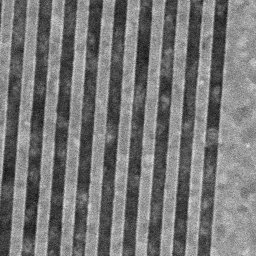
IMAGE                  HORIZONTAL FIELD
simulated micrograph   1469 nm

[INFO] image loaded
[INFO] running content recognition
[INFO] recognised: parallel lines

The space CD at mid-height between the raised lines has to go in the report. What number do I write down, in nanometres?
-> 81.6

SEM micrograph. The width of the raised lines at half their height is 61.6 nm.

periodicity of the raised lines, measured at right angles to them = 0.144 micrometres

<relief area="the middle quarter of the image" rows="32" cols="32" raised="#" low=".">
...##....##....###...###....##..
..###....##....##....###...###..
..###....##....##....###...###..
..###....##....##....###...###..
..###....##....##....###...###..
..###...###....##....##....###..
..###...###....##....##....###..
..###...###....##....##....###..
..##....###...###....##....##...
..##....###...###....##....##...
..##....###...###....##....##...
..##....##....###....##....##...
..##....##....###...###....##...
..##....##....###...###....##...
..##....##....###...###....##...
.###....##....##....###....##...
.###....##....##....###...###...
.###....##....##....###...###...
.###....##....##....###...###...
.###...###....##....##....###...
.###...###....##....##....###...
.###...###....##....##....###...
.##....###...###....##....##....
.##....###...###....##....##....
.##....###...###....##....###...
.##....##....###....##....##....
.##....##....###...###....##....
.##....##....###...###....##....
.##....##....###...###....##....
###....##....##....###....##....
###....##....##....###...###....
###....##....##....###...###....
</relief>